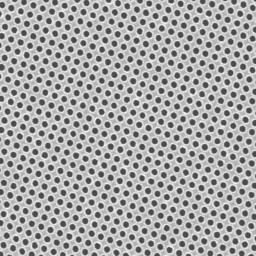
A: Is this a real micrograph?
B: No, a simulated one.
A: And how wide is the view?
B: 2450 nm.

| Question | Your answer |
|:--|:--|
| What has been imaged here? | a regular array of holes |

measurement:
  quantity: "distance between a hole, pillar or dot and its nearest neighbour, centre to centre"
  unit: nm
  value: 92.5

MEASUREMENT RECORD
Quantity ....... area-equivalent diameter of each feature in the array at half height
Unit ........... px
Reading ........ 6.38